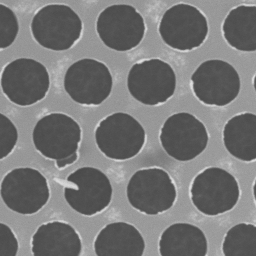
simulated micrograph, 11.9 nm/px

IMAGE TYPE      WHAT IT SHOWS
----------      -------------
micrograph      a regular array of holes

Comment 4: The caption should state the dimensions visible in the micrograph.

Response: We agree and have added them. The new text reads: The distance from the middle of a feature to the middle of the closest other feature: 748 nm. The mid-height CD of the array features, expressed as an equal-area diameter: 0.564 micrometres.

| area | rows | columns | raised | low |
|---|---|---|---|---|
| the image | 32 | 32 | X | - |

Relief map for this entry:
XXXXXXXXXXXXXXXXXXXXXX-XXXXXXXXX
--XXX----XXXX----XXXX----XXXX---
--XX------XX------XX------XX----
--XX------XX------XX------XX----
--XX------XX------XX------XX----
-XXXX----XXXX----XXXX----XXXX---
XXXXXXXXXXXXXXXXXXXXXXXXXXXXXXXX
XX--XXXXXX--XXXXXXX-XXXXXX-XXXXX
X-----XXX----XXX-----XXXX----XXX
------XX------XX------XX------XX
------XX------XX------XX------XX
------XX------XX------XX------XX
X----XXXX----XXXX----XXXX----XXX
XXXXXXXXXXXXXXXXXXXXXXXXXXXXXXXX
-XXXXX--XXXXXX--XXXXX---XXXXXX--
--XXX-----XX-----XXXX----XXX----
--XX------XX------XX------XX----
--XX------XX------XX------XX----
--XXX-----XX------XX------XX----
-XXXXX----XXX----XXXX----XXXX---
XXXXXXX--XXXXXXXXXXXXXXXXXXXXXXX
X----XXXX----XXXX----XXXX---XXXX
------XXX-----XX-----XXX-----XXX
------XX------XX------XX------XX
------XX------XX------XX------XX
X-----XXX-----XX------XX-----XXX
XX--XXXXXX--XXXXXX--XXXXX---XXXX
XXXXXXXXXXXXXXXXXXXXXXXXXXXXXXXX
-XXXX----XXXX----XXXX----XXXX---
--XX------XX------XX------XX----
--XX------XX------XX------XX----
--XX------XX------XX------XX----